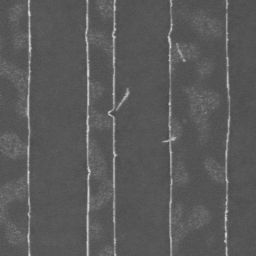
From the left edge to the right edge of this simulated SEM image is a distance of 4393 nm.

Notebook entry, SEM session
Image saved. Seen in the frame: one or a few lines or trenches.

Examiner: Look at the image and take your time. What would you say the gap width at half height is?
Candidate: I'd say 965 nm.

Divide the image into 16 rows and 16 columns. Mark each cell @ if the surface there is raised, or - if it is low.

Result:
@@---@@----@@@--
@@---@@----@@@--
@@---@@----@@@--
@@---@@----@@@--
@@---@@----@@@--
@@---@@----@@@--
@@---@@----@@@--
@@---@@----@@@--
@@---@@----@@@--
@@---@@----@@@--
@@---@@----@@@--
@@----@----@@@--
@@---@@----@@@--
@@---@@----@@@--
@@---@@----@@@--
@@---@@----@@@--